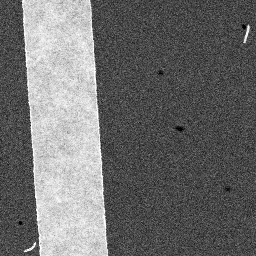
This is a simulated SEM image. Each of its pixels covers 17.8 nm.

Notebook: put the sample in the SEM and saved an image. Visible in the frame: one or a few lines or trenches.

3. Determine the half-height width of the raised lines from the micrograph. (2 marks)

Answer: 1200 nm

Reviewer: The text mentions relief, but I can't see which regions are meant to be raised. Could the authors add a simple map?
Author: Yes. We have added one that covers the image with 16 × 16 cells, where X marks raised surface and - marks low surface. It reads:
-XXXXX----------
--XXXX----------
--XXXX----------
--XXXX----------
--XXXX----------
--XXXX----------
--XXXX----------
--XXXX----------
--XXXX----------
--XXXX----------
--XXXX----------
--XXXX----------
--XXXX----------
--XXXXX---------
--XXXXX---------
--XXXXX---------